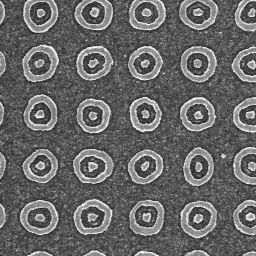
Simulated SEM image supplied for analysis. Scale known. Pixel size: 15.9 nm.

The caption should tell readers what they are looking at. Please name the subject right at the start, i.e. a regular array of ring-shaped raised bodies with a dot in the middle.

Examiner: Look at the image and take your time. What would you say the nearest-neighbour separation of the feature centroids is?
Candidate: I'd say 804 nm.